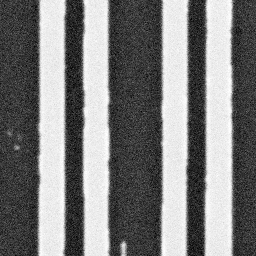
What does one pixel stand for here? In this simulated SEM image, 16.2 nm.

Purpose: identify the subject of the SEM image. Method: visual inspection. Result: lines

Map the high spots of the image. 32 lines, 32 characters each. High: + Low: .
.....+++...++.......+++...+++...
.....+++...++.......+++...+++...
.....+++...++.......+++...+++...
.....+++...++.......+++...+++...
.....+++...++.......+++...+++...
.....+++...++.......+++...+++...
.....+++...++.......+++...+++...
.....+++...++.......+++...+++...
.....+++...++.......+++...+++...
.....+++...++.......+++...+++...
.....+++...++.......+++...+++...
.....+++...++.......+++...+++...
.....+++...++.......+++...+++...
.....+++...++.......+++...+++...
.....+++...++.......+++...+++...
.....+++...++.......+++...+++...
.....+++...++.......+++...+++...
.....+++...++.......+++...+++...
.....+++...++.......+++...+++...
.....+++...++.......+++...+++...
.....+++...++.......+++...+++...
.....+++...++.......+++...+++...
.....+++...++.......+++...+++...
.....+++...++.......+++...+++...
.....+++...++.......+++...+++...
.....+++...++.......+++...+++...
.....+++...++.......+++...+++...
.....+++...++.......+++...+++...
.....+++...++.......+++...+++...
.....+++...++.......+++...+++...
.....+++...++.......+++...+++...
.....+++...++.......+++...+++...